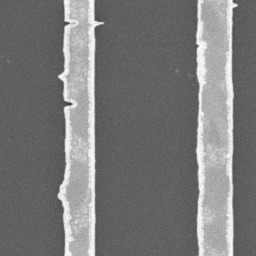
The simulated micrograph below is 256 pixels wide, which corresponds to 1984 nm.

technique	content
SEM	one or a few lines or trenches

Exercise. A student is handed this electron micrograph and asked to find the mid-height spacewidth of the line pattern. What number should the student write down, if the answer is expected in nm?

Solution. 820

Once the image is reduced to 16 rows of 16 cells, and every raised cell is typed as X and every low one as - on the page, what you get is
----XX------XXX-
----XX------XX--
----XX------XX--
----XX------XX--
----XX------XX--
----XX-------X--
----XX------XX--
----XX------XX--
----XX------XX--
----XX------XX--
----XX------XX--
----XX-------X--
----XX------XX--
----XX------XX--
----XX------XX--
----XX------XX--